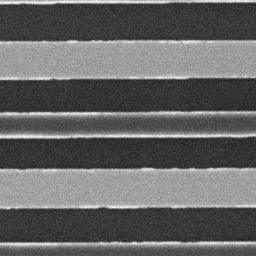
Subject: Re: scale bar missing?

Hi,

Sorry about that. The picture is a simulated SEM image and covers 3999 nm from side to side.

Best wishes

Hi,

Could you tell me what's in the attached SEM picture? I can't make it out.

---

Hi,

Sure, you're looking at lines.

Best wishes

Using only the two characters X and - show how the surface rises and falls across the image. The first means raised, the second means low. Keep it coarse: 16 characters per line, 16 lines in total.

----------------
----------------
----------------
XXXXXXXXXXXXXXXX
XXXXXXXXXXXXXXXX
----------------
----------------
XXXXXXXXXXXXXXXX
XXXXXXXXXXXXXXXX
----------------
----------------
XXXXXXXXXXXXXXXX
XXXXXXXXXXXXXXXX
----------------
----------------
XXXXXXXXXXXXXXXX